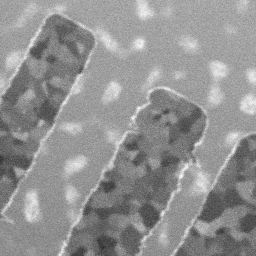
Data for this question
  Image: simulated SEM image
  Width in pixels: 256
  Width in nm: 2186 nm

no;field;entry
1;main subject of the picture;one or a few lines or trenches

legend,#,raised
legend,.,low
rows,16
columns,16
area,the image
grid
................
...##...........
..####..........
..####..........
.####...........
#####...........
####.....###....
###.....#####...
###.....#####..#
##.....#####...#
##.....#####..##
#.....#####..###
#....######..###
.....#####..####
....#####...####
....#####..#####